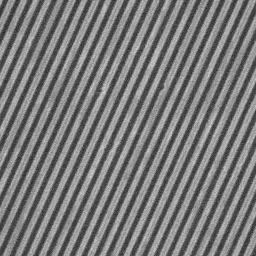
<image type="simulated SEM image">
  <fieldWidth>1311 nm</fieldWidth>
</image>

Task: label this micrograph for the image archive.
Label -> parallel lines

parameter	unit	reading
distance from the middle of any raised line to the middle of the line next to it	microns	0.0563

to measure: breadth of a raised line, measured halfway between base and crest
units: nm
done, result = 27.5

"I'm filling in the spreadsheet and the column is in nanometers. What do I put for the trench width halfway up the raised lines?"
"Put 26.9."